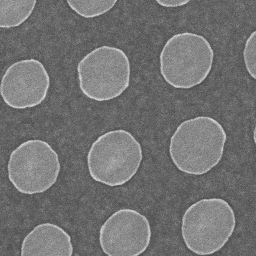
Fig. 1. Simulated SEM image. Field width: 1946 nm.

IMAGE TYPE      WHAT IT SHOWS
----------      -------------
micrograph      raised bodies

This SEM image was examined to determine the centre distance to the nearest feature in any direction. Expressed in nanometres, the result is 619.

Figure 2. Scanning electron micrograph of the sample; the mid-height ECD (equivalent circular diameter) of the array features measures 0.405 micrometres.